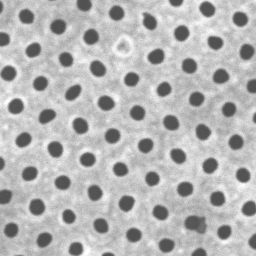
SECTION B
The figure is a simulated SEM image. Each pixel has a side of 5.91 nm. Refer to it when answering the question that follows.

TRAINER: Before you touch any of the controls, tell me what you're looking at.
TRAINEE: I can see a regular array of holes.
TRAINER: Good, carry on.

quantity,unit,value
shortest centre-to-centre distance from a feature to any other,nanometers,198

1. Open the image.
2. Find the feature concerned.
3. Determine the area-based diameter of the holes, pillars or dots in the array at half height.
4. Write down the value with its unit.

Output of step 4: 93.9 nm